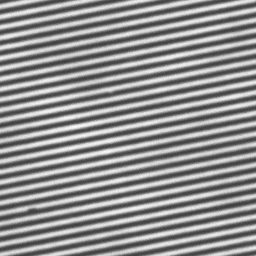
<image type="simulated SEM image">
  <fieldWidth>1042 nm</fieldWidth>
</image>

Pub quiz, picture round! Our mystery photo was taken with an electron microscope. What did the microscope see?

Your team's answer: parallel lines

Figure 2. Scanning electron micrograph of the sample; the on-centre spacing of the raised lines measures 41.4 nm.